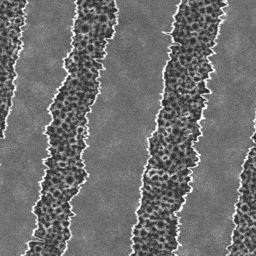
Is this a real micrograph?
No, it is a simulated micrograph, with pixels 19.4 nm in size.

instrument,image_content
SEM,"one or a few lines or trenches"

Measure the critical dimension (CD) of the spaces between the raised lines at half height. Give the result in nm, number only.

1080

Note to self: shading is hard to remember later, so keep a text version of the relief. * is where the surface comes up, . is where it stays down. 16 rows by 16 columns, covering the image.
**...**....***..
*....**....***..
*....**....**...
*...**.....**...
*...**....***...
*...**....***...
*..***....***...
...**.....***...
...**....***....
...**....***....
...**....***...*
...**....***...*
..***....***...*
..**.....**....*
..**....***....*
..**....***...**